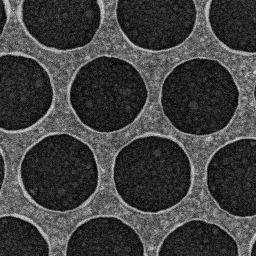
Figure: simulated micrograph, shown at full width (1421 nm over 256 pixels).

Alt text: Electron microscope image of holes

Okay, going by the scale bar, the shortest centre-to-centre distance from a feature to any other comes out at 503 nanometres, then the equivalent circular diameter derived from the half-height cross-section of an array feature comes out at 431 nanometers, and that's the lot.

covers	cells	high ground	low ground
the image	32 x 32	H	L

LHHLLLLLLLLLHHHLLLLLLLLLHHLLLLLL
LHHLLLLLLLLLLHHLLLLLLLLLLHLLLLLL
LHHLLLLLLLLLLHHLLLLLLLLLLHLLLLLL
HHHLLLLLLLLLHHHLLLLLLLLLHHLLLLLL
HHHHLLLLLLLLHHHHLLLLLLLLHHHLLLLL
HHHHHLLLLLLHHHHHHLLLLLLHHHHHLLLL
HHHHHHHHHHHHHHHHHHHHHHHHHHHHHLLL
LLLLHHHHHHHHLLLHHHHHHHHHLLLHHHHH
LLLLLHHHHHLLLLLLLHHHHHLLLLLLHHHH
LLLLLLHHHLLLLLLLLLHHHLLLLLLLLHHH
LLLLLLHHHLLLLLLLLLHHLLLLLLLLLHHH
LLLLLLLHHLLLLLLLLLHHLLLLLLLLLLHH
LLLLLLLHHLLLLLLLLLHHLLLLLLLLLLHH
LLLLLLHHHLLLLLLLLLHHLLLLLLLLLLHH
LLLLLHHHHHLLLLLLLHHHHLLLLLLLLHHH
LLLLHHHHHHHLLLLLHHHHHLLLLLLLHHHH
HHHHHHHHHHHHLLHHHHHHHHHLLLLHHHHH
HHHHHLLLLLHHHHHHHLLLLLHHHHHHHHLL
HHHHLLLLLLLHHHHLLLLLLLLHHHHHLLLL
HHHLLLLLLLLLHHHLLLLLLLLHHHHLLLLL
LHHLLLLLLLLLHHLLLLLLLLLLHHLLLLLL
LHLLLLLLLLLLHHLLLLLLLLLLHHLLLLLL
HHHLLLLLLLLLHHLLLLLLLLLLHHLLLLLL
HHHLLLLLLLLLHHLLLLLLLLLLHHLLLLLL
HHHHLLLLLLLLHHHLLLLLLLLHHHLLLLLL
HHHHHLLLLLLHHHHHLLLLLLHHHHHLLLLL
HHHHHHHHHHHHHHHHHHLLHHHHHHHHLLLL
LLLHHHHHHHHLLLLHHHHHHHHHLHHHHHHH
LLLLLHHHHHLLLLLLLHHHHHLLLLLLHHHH
LLLLLHHHHLLLLLLLLHHHHLLLLLLLLHHH
LLLLLLHHLLLLLLLLLLHHLLLLLLLLLLHL
LLLLLLHHLLLLLLLLLLHHLLLLLLLLLLHL